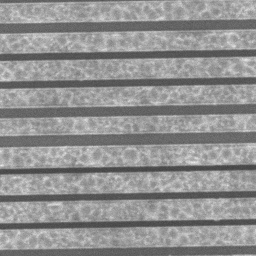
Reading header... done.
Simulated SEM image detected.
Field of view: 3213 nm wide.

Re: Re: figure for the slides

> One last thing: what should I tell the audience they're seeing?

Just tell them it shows parallel lines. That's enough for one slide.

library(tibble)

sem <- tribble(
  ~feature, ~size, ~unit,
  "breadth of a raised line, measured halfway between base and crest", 248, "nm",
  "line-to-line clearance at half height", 102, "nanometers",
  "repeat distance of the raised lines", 354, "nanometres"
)